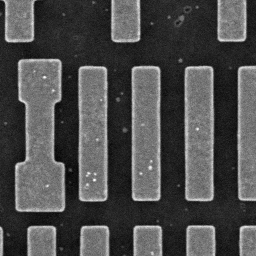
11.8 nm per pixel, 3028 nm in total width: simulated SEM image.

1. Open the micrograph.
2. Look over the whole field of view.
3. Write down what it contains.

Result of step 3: wiring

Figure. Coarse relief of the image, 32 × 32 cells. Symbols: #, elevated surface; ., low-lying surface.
.###..........###..........####.
.###..........###..........####.
.###..........###..........####.
.###..........###..........####.
.###..........###..........####.
................................
................................
...####.........................
..######..###....###....##....##
..######..###....###...####...##
..######..###....###...####...##
..######..###....###...####...##
...####...###....###...####...##
...####...###....###...####...##
...####...###....###...####...##
...####...###....###...####...##
...####...###....###...####...##
...####...###....###...####...##
...####...###....###...####...##
...####...###....###...####...##
..######..###....###...####...##
..######..###....###...####...##
..######..###....###...####...##
..######..###....###...####...##
..######..###....###...####...##
..######........................
................................
................................
....###...###....###....###...##
...####...####...###...####...##
...####...####...###...####...##
...####...####...###...####...##